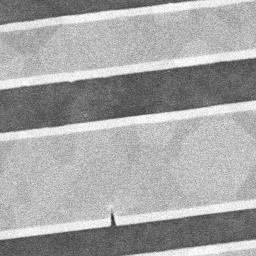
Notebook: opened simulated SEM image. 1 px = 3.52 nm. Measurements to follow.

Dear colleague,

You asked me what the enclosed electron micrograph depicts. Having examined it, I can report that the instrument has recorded one or a few lines or trenches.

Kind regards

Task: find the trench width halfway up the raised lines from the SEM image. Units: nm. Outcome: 176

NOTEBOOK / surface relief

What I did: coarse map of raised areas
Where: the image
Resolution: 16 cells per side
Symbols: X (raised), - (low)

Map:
----------XXXXXX
--XXXXXXXXXXXXXX
XXXXXXXXXXXXXXXX
XXXXXXXXXXXXXXX-
XXXXXXX---------
----------------
----------------
--------XXXXXXXX
-XXXXXXXXXXXXXXX
XXXXXXXXXXXXXXXX
XXXXXXXXXXXXXXXX
XXXXXXXXXXXXXXXX
XXXXXXXXXXXXXXXX
XXXXXXXXXX------
XX--------------
--------------XX